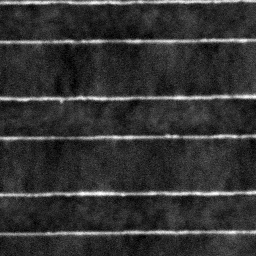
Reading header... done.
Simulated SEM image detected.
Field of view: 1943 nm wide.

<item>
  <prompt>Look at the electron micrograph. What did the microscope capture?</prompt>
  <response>lines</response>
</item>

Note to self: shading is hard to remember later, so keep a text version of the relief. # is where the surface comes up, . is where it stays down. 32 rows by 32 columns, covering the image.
................................
................................
................................
................................
................................
################################
################################
################################
################################
################################
################################
################################
..##............................
................................
................................
................................
................................
################################
################################
################################
################################
################################
################################
################################
....#...........................
................................
................................
................................
................................
################################
################################
################################